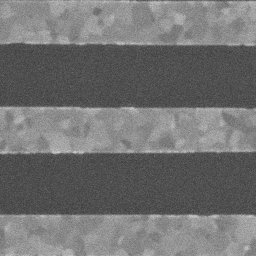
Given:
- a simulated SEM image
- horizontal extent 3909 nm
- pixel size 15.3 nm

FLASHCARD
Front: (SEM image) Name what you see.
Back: lines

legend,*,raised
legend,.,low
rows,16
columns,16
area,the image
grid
****************
****************
****************
................
................
................
................
****************
****************
******..........
................
................
................
****************
****************
****************